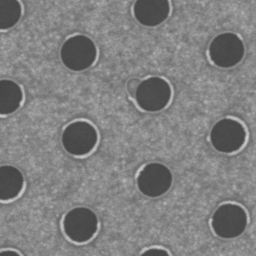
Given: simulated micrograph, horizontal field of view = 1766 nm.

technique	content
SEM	a regular array of holes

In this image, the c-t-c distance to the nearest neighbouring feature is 85.1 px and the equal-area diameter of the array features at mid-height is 243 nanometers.